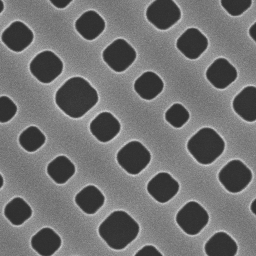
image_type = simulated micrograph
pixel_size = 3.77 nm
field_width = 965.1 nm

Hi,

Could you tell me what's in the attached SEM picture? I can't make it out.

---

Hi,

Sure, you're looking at a regular array of holes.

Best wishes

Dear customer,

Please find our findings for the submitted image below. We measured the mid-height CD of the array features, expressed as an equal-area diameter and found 0.11 micrometres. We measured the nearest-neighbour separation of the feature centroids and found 158 nanometres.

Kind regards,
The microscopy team